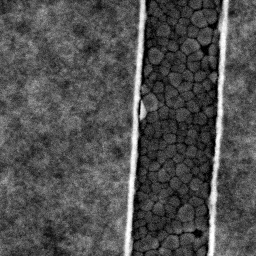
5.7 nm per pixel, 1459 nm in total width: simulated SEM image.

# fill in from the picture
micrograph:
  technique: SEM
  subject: one or a few lines or trenches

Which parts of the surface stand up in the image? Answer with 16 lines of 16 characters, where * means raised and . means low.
*********.....**
*********.....**
*********.....**
*********.....**
*********.....**
*********.....**
*********.....**
********......**
********......**
********......**
********.....***
********.....***
********.....***
********.....***
********.....***
********.....***